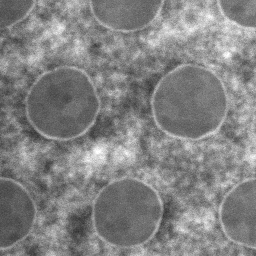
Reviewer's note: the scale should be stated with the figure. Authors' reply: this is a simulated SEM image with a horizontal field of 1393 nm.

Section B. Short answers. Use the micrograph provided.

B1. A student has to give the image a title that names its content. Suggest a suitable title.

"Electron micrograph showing raised bodies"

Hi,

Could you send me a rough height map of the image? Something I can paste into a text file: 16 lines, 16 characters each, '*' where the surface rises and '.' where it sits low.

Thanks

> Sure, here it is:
**....****....**
*.....***......*
................
................
...**......**...
..****....****..
..****....****..
..****....****..
...**......**...
................
................
*......**......*
**....****....**
**....****....**
**....****....**
................